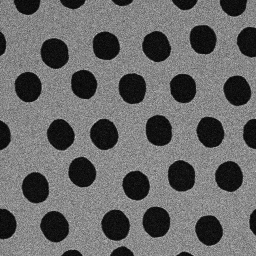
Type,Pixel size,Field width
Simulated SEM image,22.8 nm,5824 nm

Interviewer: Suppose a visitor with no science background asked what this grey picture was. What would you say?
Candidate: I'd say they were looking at a regular array of holes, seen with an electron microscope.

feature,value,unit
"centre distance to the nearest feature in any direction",998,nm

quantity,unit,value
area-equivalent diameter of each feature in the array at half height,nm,660